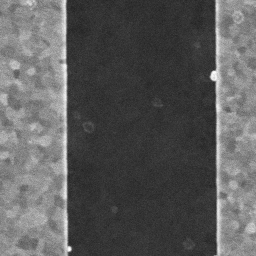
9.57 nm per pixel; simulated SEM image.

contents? wiring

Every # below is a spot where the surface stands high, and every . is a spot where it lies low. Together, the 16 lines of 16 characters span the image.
####..........##
####..........##
####..........##
####..........##
####.........###
####..........##
####..........##
####..........##
####..........##
####..........##
####..........##
####..........##
####..........##
####..........##
####..........##
####..........##